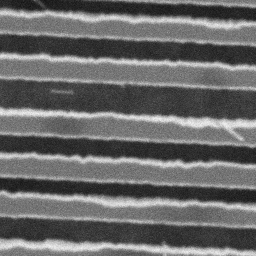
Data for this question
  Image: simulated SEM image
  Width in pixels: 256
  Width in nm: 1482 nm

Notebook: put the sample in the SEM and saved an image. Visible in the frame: lines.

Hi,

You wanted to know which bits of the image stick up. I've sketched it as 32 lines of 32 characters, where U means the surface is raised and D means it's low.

DDDDDDDDDDDDDDDDDDDDDDDDDUUUUUUU
UUUDDUUDDDDDDDDDDDDDDDDDDDDDDDDD
UUUUUUUUUUUUUUUUUUUUUUUUUUDDDDDD
UUUUUUUUUUUUUUUUUUUUUUUUUUUUUUUU
DDDDDDDDUUUUUUUUUUUUUUUUUUUUUUUU
DDDDDDDDDDDDDDDDDDDDDDDDDDDUUUUU
DDDDDDDDDDDDDDDDDDDDDDDDDDDDDDDD
UUUUUUUUUUUUUUUDDDDDDDDDDDDDDDDD
UUUUUUUUUUUUUUUUUUUUUUUUUUUUUUUU
UUUUUUUUUUUUUUUUUUUUUUUUUUUUUUUU
DDDDDDDDDDDDDDDDDUUUUUUUUUUUUUUU
DDDDDDDDDDDDDDDDDDDDDDDDDDDDDDDD
DDDDDDDDDDDDDDDDDDDDDDDDDDDDDDDD
DDDDDDDDDDDDDDDDDDDDDDDDDDDDDDDD
UUUUUUUUUUUUUUUUDDDDDDDDDDDDDDDD
UUUUUUUUUUUUUUUUUUUUUUUUUUUUUUUU
UUUUUUUUUUUUUUUUUUUUUUUUUUUUUUUU
DDDDDDDDDDDDDDDUUUUUUUUUUUUUUUUU
DDDDDDDDDDDDDDDDDDDDDDDDDDDDDDDD
UUUUUUDUDDDDDDDDDDDDDDDDDDDDDDDD
UUUUUUUUUUUUUUUUUUUUUUUUUUUUUUDD
UUUUUUUUUUUUUUUUUUUUUUUUUUUUUUUU
DDDDDDDDUUUUUUUUUUUUUUUUUUUUUUUU
DDDDDDDDDDDDDDDDDDDDDDDDDDDDDDDU
UUUUUUUUDUDDDDDDDDDDDDDDDDDDDDDD
UUUUUUUUUUUUUUUUUUUUUUUUUUUUDDDD
UUUUUUUUUUUUUUUUUUUUUUUUUUUUUUUU
DDDDDDDDDDDUUUUUUUUUUUUUUUUUUUUU
DDDDDDDDDDDDDDDDDDDDDDDDDDDDDDDD
DDDDDDDDDDDDDDDDDDDDDDDDDDDDDDDD
UUUUDUUUDDDDDDDDDDDDDDDDDDDDDDDD
UUUUUUUUUUUUUUUUUUUUUUUUUUUUUUDD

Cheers